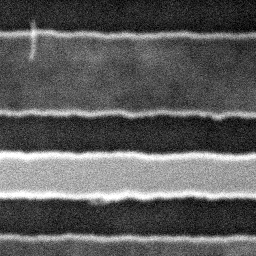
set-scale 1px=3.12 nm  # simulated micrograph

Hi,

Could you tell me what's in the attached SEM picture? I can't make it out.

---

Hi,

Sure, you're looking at lines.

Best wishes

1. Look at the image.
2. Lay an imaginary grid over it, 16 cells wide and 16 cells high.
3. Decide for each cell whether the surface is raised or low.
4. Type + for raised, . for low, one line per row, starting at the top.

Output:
................
................
++++++++++++++++
++++++++++++++++
++++++++++++++++
++++++++++++++++
++++++++++++++++
................
................
................
++++++++++++++++
++++++++++++++++
................
................
................
++++++++++++++++